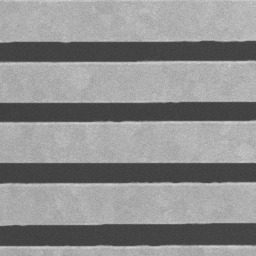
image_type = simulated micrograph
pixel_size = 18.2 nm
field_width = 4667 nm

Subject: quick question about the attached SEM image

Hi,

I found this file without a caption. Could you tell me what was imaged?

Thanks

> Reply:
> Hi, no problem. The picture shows lines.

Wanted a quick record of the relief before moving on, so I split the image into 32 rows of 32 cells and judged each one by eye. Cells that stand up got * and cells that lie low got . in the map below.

********************************
********************************
********************************
********************************
********************************
................................
................................
................................
********************************
********************************
********************************
********************************
********************************
................................
................................
********************************
********************************
********************************
********************************
********************************
................................
................................
................................
********************************
********************************
********************************
********************************
********************************
................................
................................
................................
********************************